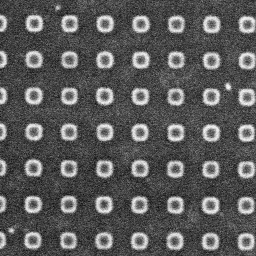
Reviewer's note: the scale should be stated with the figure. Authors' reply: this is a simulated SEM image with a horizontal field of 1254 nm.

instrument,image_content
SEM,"a regular array of raised bodies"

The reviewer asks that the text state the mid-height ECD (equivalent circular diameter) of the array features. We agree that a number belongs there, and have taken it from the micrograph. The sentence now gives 76.6 nanometres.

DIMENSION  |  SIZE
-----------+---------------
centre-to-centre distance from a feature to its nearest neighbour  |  174 nm